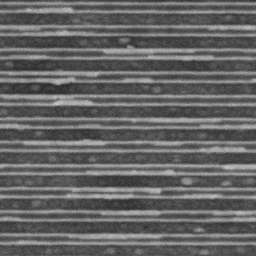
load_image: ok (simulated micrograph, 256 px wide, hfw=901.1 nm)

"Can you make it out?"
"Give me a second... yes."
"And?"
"parallel lines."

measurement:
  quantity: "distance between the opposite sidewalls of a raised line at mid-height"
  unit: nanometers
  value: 33.5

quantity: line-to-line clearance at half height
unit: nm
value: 50.2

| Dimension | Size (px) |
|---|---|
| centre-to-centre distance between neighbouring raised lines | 23.2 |